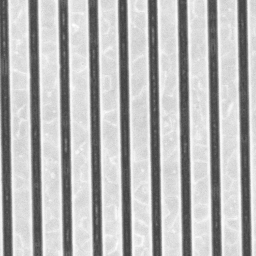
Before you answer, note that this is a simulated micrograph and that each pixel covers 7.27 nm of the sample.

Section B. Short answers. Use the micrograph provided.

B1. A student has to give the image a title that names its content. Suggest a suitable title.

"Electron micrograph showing parallel lines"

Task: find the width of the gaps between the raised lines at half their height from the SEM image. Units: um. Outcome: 0.0645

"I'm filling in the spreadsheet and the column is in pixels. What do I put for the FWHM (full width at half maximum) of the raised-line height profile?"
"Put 20.6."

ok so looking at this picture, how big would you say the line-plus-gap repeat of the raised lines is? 217 nm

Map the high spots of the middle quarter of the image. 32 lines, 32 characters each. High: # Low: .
.#####...#####..#####...#####..#
.#####...#####..#####...#####..#
.#####...#####..#####...#####..#
.#####...#####..#####...#####..#
.#####...#####..#####...#####..#
.#####...#####..#####...#####..#
.#####...#####..#####...#####..#
.#####...#####..#####...#####..#
.#####...#####..#####...#####..#
.#####...#####..#####...#####..#
..####...#####..#####...#####..#
..####...#####..#####...#####..#
..####...#####...####...#####..#
..####...#####...####...#####..#
..####...#####..#####...#####...
..#####..#####..#####...#####...
..#####..#####..#####...#####...
..#####..#####...#####..#####...
..#####..#####...#####..#####...
..#####..#####...#####..#####...
..#####..#####...#####..#####...
..#####..#####...#####..#####...
..#####..#####...#####..#####...
..#####..#####..######..#####...
..#####..#####...#####..#####...
..#####..#####...#####..#####...
..#####..#####...#####..#####...
..#####..#####...#####..#####...
..#####..#####...#####..#####...
..#####..#####...#####..#####...
..#####..#####...#####..#####...
..#####..#####...#####..#####...